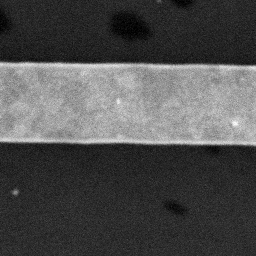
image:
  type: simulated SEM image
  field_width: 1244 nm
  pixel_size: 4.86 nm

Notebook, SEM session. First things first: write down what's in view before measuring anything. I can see wiring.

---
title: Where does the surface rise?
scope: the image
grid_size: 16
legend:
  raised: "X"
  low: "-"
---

----------------
----------------
----------------
----------------
XXXXXXXXXXXXXXXX
XXXXXXXXXXXXXXXX
XXXXXXXXXXXXXXXX
XXXXXXXXXXXXXXXX
XXXXXXXXXXXXXXXX
----------------
----------------
----------------
----------------
----------------
----------------
----------------